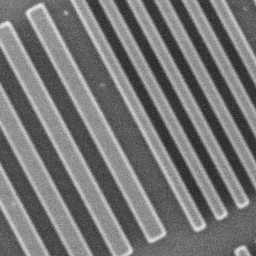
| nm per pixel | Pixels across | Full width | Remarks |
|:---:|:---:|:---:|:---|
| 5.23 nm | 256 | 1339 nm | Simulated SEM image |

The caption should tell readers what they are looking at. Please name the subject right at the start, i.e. groups of lines, slits or small figures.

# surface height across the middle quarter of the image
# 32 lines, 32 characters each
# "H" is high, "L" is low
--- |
HHHLLLLLLLLHHHLLLLHHHLLLLHHHLLLL
HHHLLLLLLLLHHHLLLLHHHLLLLHHHLLLL
HHHHLLLLLLLLHHHLLLLHHHLLLLHHHLLL
HHHHHLLLLLLLHHHHLLLHHHLLLLHHHLLL
HHHHHLLLLLLLLHHHLLLLHHHLLLLHHHLL
LHHHHHLLLLLLLHHHHLLLHHHHLLLHHHHL
LHHHHHLLLLLLLLHHHLLLLHHHLLLLHHHL
LHHHHHHLLLLLLLLHHHLLLHHHHLLLHHHL
LLHHHHHLLLLLLLLHHHLLLLHHHLLLLHHH
LLLHHHHHLLLLLLLLHHHLLLLHHHLLLLHH
LLLHHHHHLLLLLLLLHHHLLLLHHHLLLLHH
LLLLHHHHHLLLLLLLLHHHLLLLHHHLLLLH
LLLLHHHHHLLLLLLLLHHHLLLLHHHLLLLH
LLLLLHHHHHLLLLLLLLHHHLLLLHHHLLLL
LLLLLHHHHHLLLLLLLLHHHLLLLHHHLLLL
LLLLLLHHHHHLLLLLLLLHHHLLLLHHHLLL
HLLLLLHHHHHHLLLLLLLLHHHLLLHHHHLL
HLLLLLLHHHHHLLLLLLLLHHHLLLLHHHLL
HHLLLLLHHHHHLLLLLLLLHHHHLLLHHHHL
HHLLLLLLHHHHHLLLLLLLLHHHLLLLHHHL
HHHLLLLLLHHHHHLLLLLLLLHHHLLLLHHH
HHHLLLLLLHHHHHLLLLLLLLHHHLLLLHHH
HHHHLLLLLHHHHHHLLLLLLLLHHHLLLLHH
HHHHHLLLLLHHHHHLLLLLLLLHHHLLLLHH
HHHHHLLLLLLHHHHHLLLLLLLLHHHLLLLH
LHHHHLLLLLLHHHHHLLLLLLLLHHHLLLLH
LHHHHHLLLLLLHHHHHLLLLLLLLHHHLLLL
LHHHHHHLLLLLHHHHHLLLLLLLLHHHLLLL
LLHHHHHLLLLLLHHHHHLLLLLLLLHHHLLL
LLLHHHHHLLLLLHHHHHLLLLLLLLHHHLLL
LLLHHHHHLLLLLLHHHHHLLLLLLLLHHHLL
LLLLHHHHHLLLLLHHHHHHLLLLLLLHHHHL